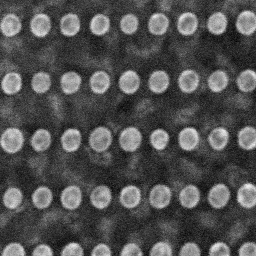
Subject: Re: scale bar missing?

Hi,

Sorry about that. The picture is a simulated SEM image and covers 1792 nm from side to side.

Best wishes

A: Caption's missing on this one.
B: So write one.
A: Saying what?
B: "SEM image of a regular array of raised bodies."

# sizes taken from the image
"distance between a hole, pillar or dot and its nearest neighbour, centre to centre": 205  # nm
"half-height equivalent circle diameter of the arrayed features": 139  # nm